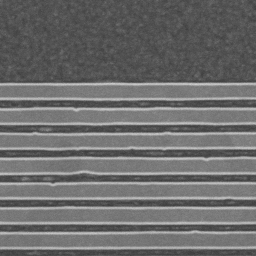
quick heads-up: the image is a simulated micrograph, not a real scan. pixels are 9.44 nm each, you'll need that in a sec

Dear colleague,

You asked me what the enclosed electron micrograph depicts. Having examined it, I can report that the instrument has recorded parallel lines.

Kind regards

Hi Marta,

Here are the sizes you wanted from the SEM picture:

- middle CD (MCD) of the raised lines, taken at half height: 0.144 µm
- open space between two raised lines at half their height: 0.0897 microns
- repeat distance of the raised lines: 234 nanometres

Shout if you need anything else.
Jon